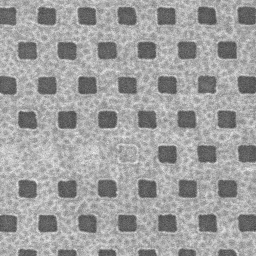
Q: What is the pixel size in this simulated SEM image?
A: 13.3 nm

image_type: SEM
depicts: a regular array of holes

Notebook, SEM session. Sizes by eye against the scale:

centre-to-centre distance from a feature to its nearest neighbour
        526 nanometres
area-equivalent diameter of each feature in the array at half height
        276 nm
